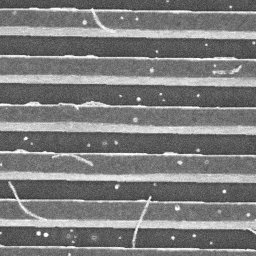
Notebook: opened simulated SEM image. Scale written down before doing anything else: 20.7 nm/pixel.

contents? lines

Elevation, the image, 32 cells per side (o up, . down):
................................
oooooooooooooooooooooooo........
oooooooooooooooooooooooooooooooo
oooooooooooooooooooooooooooooooo
................................
................................
................................
oooooooooooooooooooooooooooooooo
oooooooooooooooooooooooooooooooo
oooooooooooooooooooooooooooooooo
................................
................................
................................
ooooooooooooooooooooooooo.......
oooooooooooooooooooooooooooooooo
oooooooooooooooooooooooooooooooo
................................
................................
................................
oooooooooooooooooooooooooooooooo
oooooooooooooooooooooooooooooooo
oooooooooooooooooooooooooooooooo
................................
................................
................................
oooooooooooooooooooooooooooooooo
oooooooooooooooooooooooooooooooo
oooooooooooooooooooooooooooooooo
................................
................................
................................
oooooooooooooooooooooooooooooooo